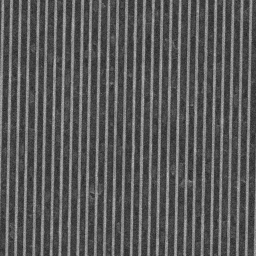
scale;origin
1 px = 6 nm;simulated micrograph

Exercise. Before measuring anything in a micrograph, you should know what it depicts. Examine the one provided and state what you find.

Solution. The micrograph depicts parallel lines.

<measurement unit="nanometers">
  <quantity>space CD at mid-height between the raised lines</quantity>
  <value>41.2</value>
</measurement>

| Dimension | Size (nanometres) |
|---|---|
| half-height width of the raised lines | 12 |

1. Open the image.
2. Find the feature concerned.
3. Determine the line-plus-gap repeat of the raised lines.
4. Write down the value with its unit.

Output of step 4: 53.2 nm